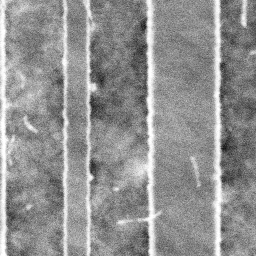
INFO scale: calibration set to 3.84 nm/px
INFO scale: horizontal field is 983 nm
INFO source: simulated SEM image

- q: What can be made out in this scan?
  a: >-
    lines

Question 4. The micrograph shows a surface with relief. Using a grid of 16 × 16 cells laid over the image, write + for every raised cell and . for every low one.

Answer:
....++...+++++..
....++...+++++..
....++...+++++..
....++...+++++..
....++...+++++..
....++...+++++..
....++...+++++..
....++...+++++..
....++...+++++..
....++...+++++..
....++...+++++..
....++...+++++..
....++...+++++..
....++...+++++..
....++...+++++..
....++...+++++..